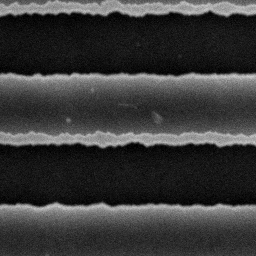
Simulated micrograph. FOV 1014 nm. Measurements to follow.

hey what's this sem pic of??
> lines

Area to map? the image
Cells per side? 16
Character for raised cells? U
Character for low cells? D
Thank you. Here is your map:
UUUUUUUUUUUUUUUU
DDDDDDDDDDDDDDDD
DDDDDDDDDDDDDDDD
DDDDDDDDDDDDDDDD
DDDDDDDDDDDDDDDD
UUUUUUUUUUUUUUUU
UUUUUUUUUUUUUUUU
UUUUUUUUUUUUUUUU
UUUUUUUUUUUUUUUU
DDDDDDDDDDDDDDDD
DDDDDDDDDDDDDDDD
DDDDDDDDDDDDDDDD
DDDDDDDDDDDDDDDD
UUUUUUUUUUUUUUUU
UUUUUUUUUUUUUUUU
UUUUUUUUUUUUUUUU